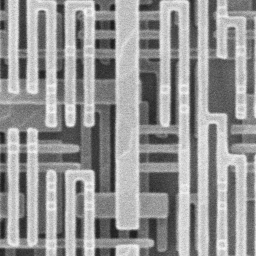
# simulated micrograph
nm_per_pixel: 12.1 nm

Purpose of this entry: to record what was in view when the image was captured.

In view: wiring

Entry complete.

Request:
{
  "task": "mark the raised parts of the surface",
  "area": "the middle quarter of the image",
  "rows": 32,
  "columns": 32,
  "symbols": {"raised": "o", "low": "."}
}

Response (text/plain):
ooo..oo......ooooo......oo...oo.
ooo..oo......oooooo.....oo...oo.
ooo..oo......oooooo.....oo...oo.
ooo..ooo.....oooooo.....oo...oo.
ooooooooooooooooooo.....oo...oo.
ooooooooooooooooooo.....oo...oo.
ooooooooooooooooooo.....oo...oo.
ooooooooooooooooooo.....oo...oo.
ooooooooooooooooooo.....oo...oo.
ooooooooooooooooooo.....oo...oo.
ooo..oo......ooooo......oo...oo.
ooo..oo......oooooo.....oo...oo.
ooo..oo......oooooo.....oo...oo.
ooo..oo......oooooo.....oo...oo.
.oo..oo......oooooo.....oo...oo.
.............oooooooooooooooooo.
.............oooooooooooooooooo.
.............oooooo..........oo.
.............oooooo..........oo.
.............oooooo..........oo.
ooo..........oooooooooooooooooo.
oooo.........oooooooooooooooooo.
.............oooooo.........ooo.
.............oooooo..........oo.
.............oooooo..........oo.
oooo.........oooooooooooooooooo.
oooo.........oooooooooooooooooo.
ooooooo......oooooo..........oo.
ooooooo......oooooo..........oo.
ooo..oo......oooooo..........oo.
.oo..oo......oooooo..........oo.
.oo..oo......oooooo..........oo.